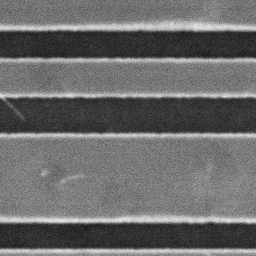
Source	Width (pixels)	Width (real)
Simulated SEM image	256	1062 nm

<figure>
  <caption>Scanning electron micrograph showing lines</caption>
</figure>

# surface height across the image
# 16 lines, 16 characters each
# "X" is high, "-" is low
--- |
XXXXXXXXXXXXXXXX
XXXXXXXXXXXXXXXX
----------------
----------------
XXXXXXXXXXXXXXXX
XXXXXXXXXXXXXXXX
----------------
----------------
XXXXXXXXXXXXXXXX
XXXXXXXXXXXXXXXX
XXXXXXXXXXXXXXXX
XXXXXXXXXXXXXXXX
XXXXXXXXXXXXXXXX
XXXXXXXXXXXXXXXX
----------------
----------------